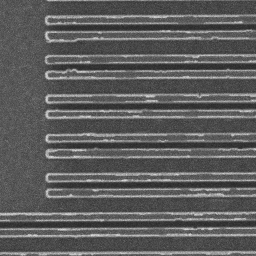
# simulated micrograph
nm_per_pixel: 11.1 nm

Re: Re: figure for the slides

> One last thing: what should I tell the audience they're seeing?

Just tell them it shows parallel lines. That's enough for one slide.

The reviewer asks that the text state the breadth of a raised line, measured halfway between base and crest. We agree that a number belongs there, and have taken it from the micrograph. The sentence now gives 0.0956 microns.